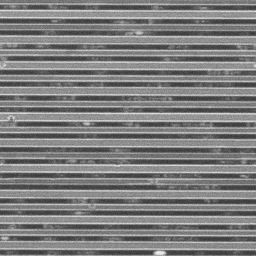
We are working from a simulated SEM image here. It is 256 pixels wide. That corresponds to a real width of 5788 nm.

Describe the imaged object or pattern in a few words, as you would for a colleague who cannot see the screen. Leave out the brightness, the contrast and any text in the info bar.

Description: parallel lines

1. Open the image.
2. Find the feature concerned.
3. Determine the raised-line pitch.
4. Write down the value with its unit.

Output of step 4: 0.291 microns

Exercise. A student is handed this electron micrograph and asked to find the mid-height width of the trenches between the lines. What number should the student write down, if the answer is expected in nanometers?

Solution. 136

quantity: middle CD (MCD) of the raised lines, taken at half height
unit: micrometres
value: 0.155